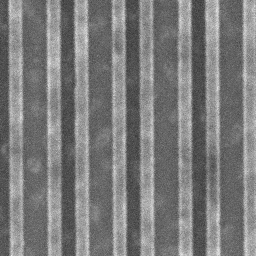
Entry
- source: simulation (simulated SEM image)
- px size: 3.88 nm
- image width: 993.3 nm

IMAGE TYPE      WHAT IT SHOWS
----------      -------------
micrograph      parallel lines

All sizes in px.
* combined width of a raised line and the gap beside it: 32.8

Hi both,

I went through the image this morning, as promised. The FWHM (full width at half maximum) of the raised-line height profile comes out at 46.1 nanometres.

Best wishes